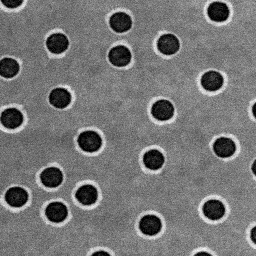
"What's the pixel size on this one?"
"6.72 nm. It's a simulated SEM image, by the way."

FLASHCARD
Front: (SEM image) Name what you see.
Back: a regular array of holes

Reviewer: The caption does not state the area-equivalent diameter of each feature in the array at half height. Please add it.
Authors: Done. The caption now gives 157 nm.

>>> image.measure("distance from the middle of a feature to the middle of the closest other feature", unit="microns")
0.339